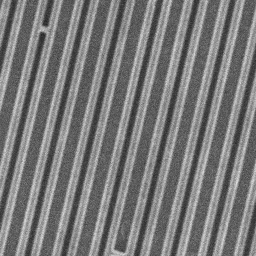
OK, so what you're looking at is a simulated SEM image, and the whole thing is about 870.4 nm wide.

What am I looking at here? parallel lines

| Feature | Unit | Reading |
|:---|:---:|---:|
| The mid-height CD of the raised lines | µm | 0.0257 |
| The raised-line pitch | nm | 60.2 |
